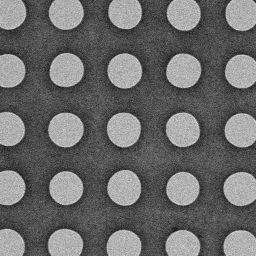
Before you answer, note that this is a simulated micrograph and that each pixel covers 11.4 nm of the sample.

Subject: an array of small figures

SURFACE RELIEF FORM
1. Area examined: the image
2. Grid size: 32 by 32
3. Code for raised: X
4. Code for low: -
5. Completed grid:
XXX----XXX----XXX----XXXX----XXX
XXX---XXXX----XXXX---XXXX---XXXX
XXX---XXXX----XXX----XXXX---XXXX
XX-----XX------X------XX-----XX-
--------------------------------
--------------------------------
--------------------------------
XXX----XXX----XXX----XXXX----XXX
XXX---XXXX----XXXX---XXXX---XXXX
XXX---XXXX----XXXX---XXXX---XXXX
XX-----XX-----XXX-----XX-----XXX
--------------------------------
--------------------------------
--------------------------------
XX-----XX-----XXX-----XX-----XX-
XXX---XXXX----XXX----XXXX---XXXX
XXX---XXXX---XXXX----XXXX---XXXX
XXX----XXX----XXX----XXXX----XXX
--------------------------------
--------------------------------
--------------------------------
XX------X------X----------------
XXX---XXXX----XXX----XXXX---XXXX
XXX---XXXX----XXXX---XXXX---XXXX
XXX---XXXX----XXX----XXXX---XXXX
XX------X------X------XX-----XX-
--------------------------------
--------------------------------
--------------------------------
XXX---XXXX----XXX----XXX-----XXX
XXX---XXXX---XXXXX---XXXX---XXXX
XXX---XXXX---XXXX----XXXX---XXXX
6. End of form